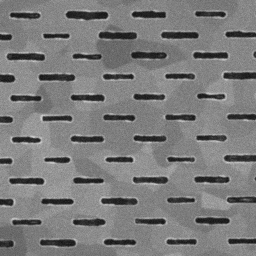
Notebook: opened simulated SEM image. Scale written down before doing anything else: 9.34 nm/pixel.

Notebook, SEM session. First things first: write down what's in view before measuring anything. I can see a regular array of holes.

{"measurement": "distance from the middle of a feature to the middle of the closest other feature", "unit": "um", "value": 0.342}